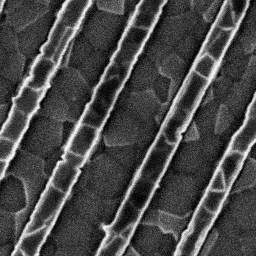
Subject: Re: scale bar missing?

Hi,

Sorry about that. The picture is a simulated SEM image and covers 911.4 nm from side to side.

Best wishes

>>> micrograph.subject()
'one or a few lines or trenches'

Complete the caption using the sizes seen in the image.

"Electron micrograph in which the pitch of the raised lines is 255 nm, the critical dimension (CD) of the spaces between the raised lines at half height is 167 nm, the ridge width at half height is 80.2 nanometers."